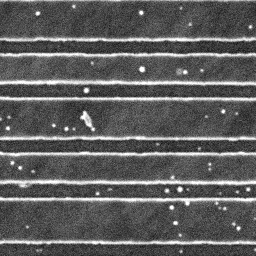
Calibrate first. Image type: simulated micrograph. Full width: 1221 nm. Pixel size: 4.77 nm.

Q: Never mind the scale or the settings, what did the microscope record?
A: lines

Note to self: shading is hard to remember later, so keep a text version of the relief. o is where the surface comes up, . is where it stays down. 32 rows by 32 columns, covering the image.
oooooooooooooooooooooooooooooooo
oooooooooooooooooooooooooooooooo
oooooooooooooooooooooooooooooooo
oooooooooooooooooooooooooooooooo
oooooooooooooooooooooooooooooooo
................................
................................
oooooooooooooooooooooooooooooooo
oooooooooooooooooooooooooooooooo
oooooooooooooooooooooooooooooooo
................................
................................
oooooooooooooooooooooooooooooooo
oooooooooooooooooooooooooooooooo
oooooooooooooooooooooooooooooooo
oooooooooooooooooooooooooooooooo
oooooooooooooooooooooooooooooooo
................................
................................
oooooooooooooooooooooooooooooooo
oooooooooooooooooooooooooooooooo
oooooooooooooooooooooooooooooooo
oooooooooooooooooooooooooooooooo
................................
................................
oooooooooooooooooooooooooooooooo
oooooooooooooooooooooooooooooooo
oooooooooooooooooooooooooooooooo
oooooooooooooooooooooooooooooooo
oooooooooooooooooooooooooooooooo
................................
................................